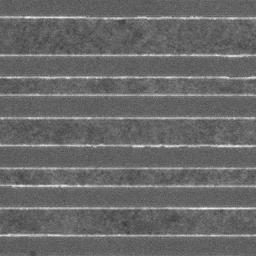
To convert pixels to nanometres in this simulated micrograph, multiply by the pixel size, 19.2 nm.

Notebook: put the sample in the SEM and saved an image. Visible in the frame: lines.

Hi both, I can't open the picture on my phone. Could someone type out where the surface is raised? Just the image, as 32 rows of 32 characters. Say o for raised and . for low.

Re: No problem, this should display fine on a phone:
................................
................................
oooooooooooooooooooooooooooooooo
oooooooooooooooooooooooooooooooo
oooooooooooooooooooooooooooooooo
oooooooooooooooooooooooooooooooo
oooooooooooooooooooooooooooooooo
................................
................................
................................
oooooooooooooooooooooooooooooooo
oooooooooooooooooooooooooooooooo
................................
................................
................................
oooooooooooooooooooooooooooooooo
oooooooooooooooooooooooooooooooo
oooooooooooooooooooooooooooooooo
................................
................................
................................
oooooooooooooooooooooooooooooooo
oooooooooooooooooooooooooooooooo
................................
................................
................................
oooooooooooooooooooooooooooooooo
oooooooooooooooooooooooooooooooo
oooooooooooooooooooooooooooooooo
................................
................................
................................